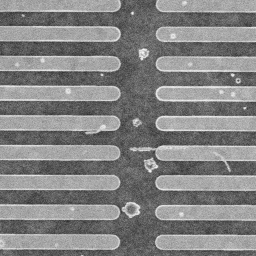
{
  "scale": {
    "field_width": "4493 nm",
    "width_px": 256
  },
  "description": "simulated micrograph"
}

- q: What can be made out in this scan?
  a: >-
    groups of lines, slits or small figures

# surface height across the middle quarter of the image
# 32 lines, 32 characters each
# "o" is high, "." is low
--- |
oooooooooooooo.........ooooooooo
ooooooooooooo...........oooooooo
................................
................................
................................
................................
oooooooooooooo.........ooooooooo
oooooooooooooo.........ooooooooo
oooooooooooooo..........oooooooo
................................
................................
................................
................................
ooooooooooooo...........oooooooo
oooooooooooooo.........ooooooooo
oooooooooooooo.........ooooooooo
ooooooooooooo...........oooooooo
................................
................................
................................
ooooooooooooo..................o
oooooooooooooo.........ooooooooo
oooooooooooooo.........ooooooooo
ooooooooooooo...........oooooooo
.....................oo.........
....................ooo.........
.....................o..........
................................
ooooooooooooo...........oooooooo
oooooooooooooo.........ooooooooo
oooooooooooooo.........ooooooooo
...............................o